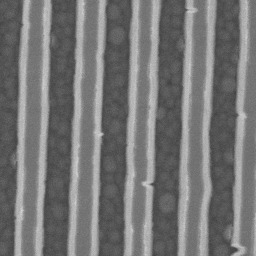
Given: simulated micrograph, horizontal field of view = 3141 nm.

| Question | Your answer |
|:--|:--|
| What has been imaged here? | parallel lines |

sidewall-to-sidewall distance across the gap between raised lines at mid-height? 33.7 pixels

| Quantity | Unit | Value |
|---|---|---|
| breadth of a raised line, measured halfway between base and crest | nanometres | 258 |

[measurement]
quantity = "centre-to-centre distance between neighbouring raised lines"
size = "669 nm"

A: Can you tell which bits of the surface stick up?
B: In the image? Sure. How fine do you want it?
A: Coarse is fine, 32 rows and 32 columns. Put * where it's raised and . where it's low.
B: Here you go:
...***....***....***....**.....*
...***....***....**.....**.....*
...***....***....**.....**.....*
...***....***....**.....**.....*
...***....***....**.....**.....*
...***....***....**.....**.....*
...***....**.....**.....**....**
...***....**.....**....***....**
...***....**.....**.....**....**
...***....**.....**....***....**
...***....**.....**....***....**
...***....**.....**....***....**
...***....**.....**....***....**
...***....**.....**....***....**
...***....**.....**....***....**
...***....**....***....***....**
...**.....**....***....***....**
...**.....**....***....***....**
...**.....**....***....***....**
...**....***....***....***....**
...**....***....***....***....**
...**....***....***....***....**
...**....***....***....***....**
...**....***....***....***....**
...**....***....***....***....**
..***....***....***....***....**
..***....***....***....**.....**
..***....***....***....***....**
..***....***....***....**.....**
..***....***....**.....**.....**
..***....***....**.....**.....**
..***....***....**.....**.....**